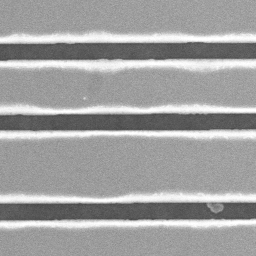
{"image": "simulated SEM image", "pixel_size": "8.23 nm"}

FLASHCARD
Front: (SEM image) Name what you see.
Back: lines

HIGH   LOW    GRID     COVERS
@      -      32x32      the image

@@@@@@@@@@@@@@@@@@@@@@@@@@@@@@@@
@@@@@@@@@@@@@@@@@@@@@@@@@@@@@@@@
@@@@@@@@@@@@@@@@@@@@@@@@@@@@@@@@
@@@@@@@@@@@@@@@@@@@@@@@@@@@@@@@@
@@@@@@@@@@@@@@@@@@@@@@@@@@@@@@@@
--------------------------------
--------------------------------
--------------------------------
@@@@@@@@@@@@@@@@@@@@@@@@@@@@@@@@
@@@@@@@@@@@@@@@@@@@@@@@@@@@@@@@@
@@@@@@@@@@@@@@@@@@@@@@@@@@@@@@@@
@@@@@@@@@@@@@@@@@@@@@@@@@@@@@@@@
@@@@@@@@@@@@@@@@@@@@@@@@@@@@@@@@
@@@@@@@@@@@@@@@@@@@@@@@@@@@@@@@@
--------------------------------
--------------------------------
@-@@-@@@@@@@@@@@@@@@@@@@@@@@@@@@
@@@@@@@@@@@@@@@@@@@@@@@@@@@@@@@@
@@@@@@@@@@@@@@@@@@@@@@@@@@@@@@@@
@@@@@@@@@@@@@@@@@@@@@@@@@@@@@@@@
@@@@@@@@@@@@@@@@@@@@@@@@@@@@@@@@
@@@@@@@@@@@@@@@@@@@@@@@@@@@@@@@@
@@@@@@@@@@@@@@@@@@@@@@@@@@@@@@@@
@@@@@@@@@@@@@@@@@@@@@@@@@@@@@@@@
@@@@@@@@@@@@@@@@@@@@@@@@@@@@@@@@
--------------------------------
--------------------------------
--------------------------------
@@@@@@@@@@@@@@@@@@@@@@@@@@@@@@@@
@@@@@@@@@@@@@@@@@@@@@@@@@@@@@@@@
@@@@@@@@@@@@@@@@@@@@@@@@@@@@@@@@
@@@@@@@@@@@@@@@@@@@@@@@@@@@@@@@@